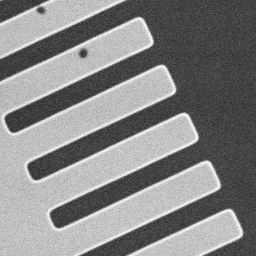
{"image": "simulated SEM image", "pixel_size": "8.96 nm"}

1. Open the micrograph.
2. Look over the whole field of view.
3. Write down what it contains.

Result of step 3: groups of lines, slits or small figures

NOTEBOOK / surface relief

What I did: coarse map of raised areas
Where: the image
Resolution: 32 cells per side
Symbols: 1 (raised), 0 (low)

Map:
00000111111111100000000000000000
00011111111100000000000000000000
01111111110000000100000000000000
11111111000000111100000000000000
11111100000011111110000000000000
11110000001111111110000000000000
11000000111111111000000000000000
00000011111111100000000000000000
00001111111110000001100000000000
00111111111000000111100000000000
11111111100000011111110000000000
11111110000001111111110000000000
11111000000111111111000000000000
11000000011111111100000000000000
10000001111111110000001000000000
10000111111111000000111100000000
10111111111100000011111110000000
11111111100000001111111110000000
11111110000000111111111000000000
11111000000111111111100000000000
11110000011111111110000001000000
11110001111111110000000111100000
11110111111111000000011111100000
11111111111100000011111111100000
11111111110000001111111111000000
11111111000000111111111000000000
11111100000011111111100000001000
11111100001111111110000001111100
11111110111111111000000111111100
11111111111111100000011111111100
11111111111110000001111111110000
11111111111000000111111111000000